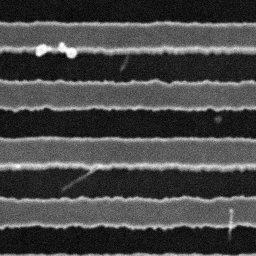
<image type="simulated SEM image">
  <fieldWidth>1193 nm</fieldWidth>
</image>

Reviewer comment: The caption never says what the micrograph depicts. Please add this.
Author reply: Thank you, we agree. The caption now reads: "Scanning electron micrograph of lines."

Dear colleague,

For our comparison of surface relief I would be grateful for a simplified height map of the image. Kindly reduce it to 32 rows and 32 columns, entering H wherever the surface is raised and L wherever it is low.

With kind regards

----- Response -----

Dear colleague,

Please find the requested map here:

LLLLLLLLLLLLLLLLLLLLLLLLLLLLLLLL
LLLLLLLLLLLLLLLLLLLLLLLLLLLLLLLL
LLLLLLLLLLLLLLLLLLLLLLLLLLLLLLLL
HHHHHHHHHHHHHHHHHHHHHHHHHHHHHHHH
HHHHHHHHHHHHHHHHHHHHHHHHHHHHHHHH
HHHHHHHHHHHHHHHHHHHHHHHHHHHHHHHH
LLLLHHLLHHLLLHLLLLLLLLLLLLLLLLLL
LLLLLLLLLLLLLLLLLLLLLLLLLLLLLLLL
LLLLLLLLLLLLLLLLLLLLLLLLLLLLLLLL
LLLLLLLLLLLLLLLLLLLLLLLLLLLLLLLL
HHHHHHHHHHHHHHHHHHHHHHHHHHHHHHHH
HHHHHHHHHHHHHHHHHHHHHHHHHHHHHHHH
HHHHHHHHHHHHHHHHHHHHHHHHHHHHHHHH
HHHHHLHHHHHLLHHHHHHHHHHHHHHHHHHH
LLLLLLLLLLLLLLLLLLLLLLLLLLLLLLLL
LLLLLLLLLLLLLLLLLLLLLLLLLLLLLLLL
LLLLLLLLLLLLLLLLLLLLLLLLLLLLLLLL
HHHHHHHHHHHHHHHHHHHHHHHHHHHHHHHH
HHHHHHHHHHHHHHHHHHHHHHHHHHHHHHHH
HHHHHHHHHHHHHHHHHHHHHHHHHHHHHHHH
HHHHHHHHHHHHHHHHHHHHHHHHHHHHHHHH
LLLLLLLLLLLLLLLLLLLLLLLLLLLLLLLL
LLLLLLLLLLLLLLLLLLLLLLLLLLLLLLLL
LLLLLLLLLLLLLLLLLLLLLLLLLLLLLLLL
LLLLLLLLLLLLLLLLLLLLLLLLLLLLLLLL
HHHHHHHHHHHHHHHHHHHHHHHHHHHHHHHH
HHHHHHHHHHHHHHHHHHHHHHHHHHHHHHHH
HHHHHHHHHHHHHHHHHHHHHHHHHHHHHHHH
HLLLLLLLLLLLLLLLHHLLHLLLLLLLHLLL
LLLLLLLLLLLLLLLLLLLLLLLLLLLLLLLL
LLLLLLLLLLLLLLLLLLLLLLLLLLLLLLLL
LLLLLLLLLLLLLLLLLLLLLLLLLLLLLLLL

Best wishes